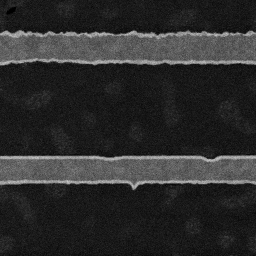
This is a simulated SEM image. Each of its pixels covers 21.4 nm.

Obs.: one or a few lines or trenches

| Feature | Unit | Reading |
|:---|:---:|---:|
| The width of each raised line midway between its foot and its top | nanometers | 539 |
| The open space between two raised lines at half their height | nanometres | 2030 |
